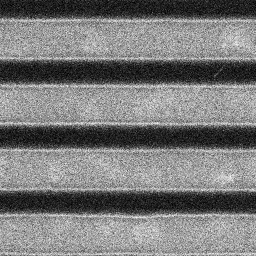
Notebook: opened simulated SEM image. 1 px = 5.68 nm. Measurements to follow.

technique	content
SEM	one or a few lines or trenches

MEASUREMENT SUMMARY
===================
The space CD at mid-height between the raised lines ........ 214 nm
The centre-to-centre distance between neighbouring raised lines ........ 370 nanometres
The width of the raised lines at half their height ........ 159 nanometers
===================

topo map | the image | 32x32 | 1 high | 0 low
11111111111111111111111111111111
11111111111111111111111111111111
11111111100001111111111111111111
00000000000000000000000000000000
00000000000000000000000000000000
00000000000000000000000000000000
00000000000000000000000000000000
11111111111111111111111111111111
11111111111111111111111111111111
11111111111111111111111111111111
11111111111111111111111111111111
00000000000000000000000000000000
00000000000000000000000000000000
00000000000000000000000000000000
00000000000000000000000000000000
11110011111111111111000000111011
11111111111111111111111111111111
11111111111111111111111111111111
11111111111111111111111111111111
00000000000000000000000000000000
00000000000000000000000000000000
00000000000000000000000000000000
00000000000000000000000000000000
00000000000000000000000000000000
11111111111111111111111111111111
11111111111111111111111111111111
11111111111111111111111111111111
00000000000000000000000000000000
00000000000000000000000000000000
00000000000000000000000000000000
00000000000000000000000000000000
00000000000000000000000000000000